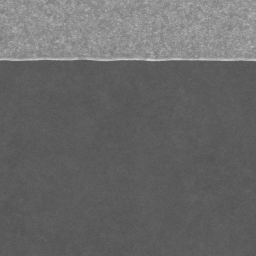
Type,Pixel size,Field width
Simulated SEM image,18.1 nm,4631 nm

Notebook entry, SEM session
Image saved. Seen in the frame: wiring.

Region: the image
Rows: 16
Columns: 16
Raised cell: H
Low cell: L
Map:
HHHHHHHHHHHHHHHH
HHHHHHHHHHHHHHHH
HHHHHHHHHHHHHHHH
HHHHHHHHHHHHHHHH
LLLLLLLLLLLLLLLL
LLLLLLLLLLLLLLLL
LLLLLLLLLLLLLLLL
LLLLLLLLLLLLLLLL
LLLLLLLLLLLLLLLL
LLLLLLLLLLLLLLLL
LLLLLLLLLLLLLLLL
LLLLLLLLLLLLLLLL
LLLLLLLLLLLLLLLL
LLLLLLLLLLLLLLLL
LLLLLLLLLLLLLLLL
LLLLLLLLLLLLLLLL